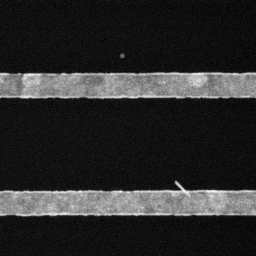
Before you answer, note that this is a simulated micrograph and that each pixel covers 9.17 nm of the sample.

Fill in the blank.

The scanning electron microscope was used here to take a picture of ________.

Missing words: lines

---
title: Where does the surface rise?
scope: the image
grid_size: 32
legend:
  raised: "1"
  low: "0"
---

00000000000000000000000000000000
00000000000000000000000000000000
00000000000000000000000000000000
00000000000000000000000000000000
00000000000000000000000000000000
00000000000000000000000000000000
00000000000000000000000000000000
00000000000000000000000000000000
00000000000000000000000000000000
11111111111111111111111111111111
11111111111111111111111111111111
11111111111111111111111111111111
00000000000000000000000000000000
00000000000000000000000000000000
00000000000000000000000000000000
00000000000000000000000000000000
00000000000000000000000000000000
00000000000000000000000000000000
00000000000000000000000000000000
00000000000000000000000000000000
00000000000000000000000000000000
00000000000000000000000000000000
00000000000000000000000000000000
00000000000000000000000000000000
11111111111111111111111111111111
11111111111111111111111111111111
11111111111111111111111111111111
00000000000000000000000000000000
00000000000000000000000000000000
00000000000000000000000000000000
00000000000000000000000000000000
00000000000000000000000000000000